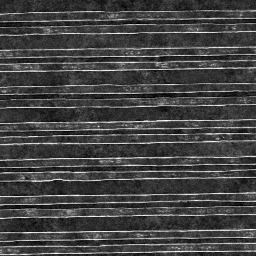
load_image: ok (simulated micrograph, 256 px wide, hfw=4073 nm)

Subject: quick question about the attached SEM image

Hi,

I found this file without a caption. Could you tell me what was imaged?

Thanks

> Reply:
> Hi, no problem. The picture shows parallel lines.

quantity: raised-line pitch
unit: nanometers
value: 286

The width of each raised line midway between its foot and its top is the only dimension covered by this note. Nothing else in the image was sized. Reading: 0.129 um